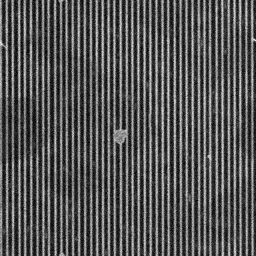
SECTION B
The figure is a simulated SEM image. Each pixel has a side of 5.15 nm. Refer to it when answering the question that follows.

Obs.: parallel lines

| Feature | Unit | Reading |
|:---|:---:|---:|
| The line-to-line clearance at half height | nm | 23.8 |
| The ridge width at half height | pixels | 1.38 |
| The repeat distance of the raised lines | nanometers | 30.9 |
